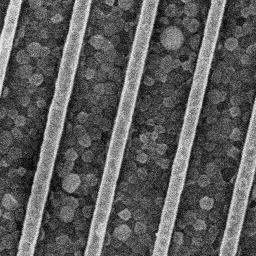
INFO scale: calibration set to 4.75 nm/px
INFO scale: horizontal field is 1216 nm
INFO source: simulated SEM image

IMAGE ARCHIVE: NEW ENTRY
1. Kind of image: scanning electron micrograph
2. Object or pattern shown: one or a few lines or trenches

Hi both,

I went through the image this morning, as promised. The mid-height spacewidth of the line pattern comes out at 248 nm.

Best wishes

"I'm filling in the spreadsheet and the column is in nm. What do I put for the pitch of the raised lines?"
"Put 312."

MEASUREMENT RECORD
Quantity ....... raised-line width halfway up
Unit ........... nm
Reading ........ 66.6